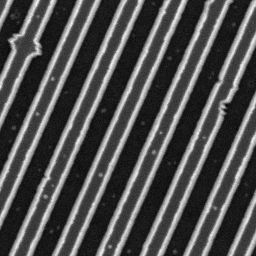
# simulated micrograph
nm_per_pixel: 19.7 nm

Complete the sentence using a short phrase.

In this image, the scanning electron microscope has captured parallel lines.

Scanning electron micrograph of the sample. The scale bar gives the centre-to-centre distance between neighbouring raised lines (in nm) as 786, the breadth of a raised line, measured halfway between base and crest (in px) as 18.5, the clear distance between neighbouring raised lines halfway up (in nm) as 432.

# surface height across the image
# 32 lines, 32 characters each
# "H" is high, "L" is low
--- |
HLLLHHHLLLHHLLLHHHLLLHHLLLHHHLLL
HLLLHHLLLHHHLLLHHLLLHHHLLLHHLLLH
LLLHHHLLLHHLLLHHHLLLHHLLLHHHLLLH
LLLHHLLLHHHLLLHHLLLHHHLLLHHLLLHH
LLHHHLLLHHLLLHHHLLLHHLLLHHHLLLHH
LHHHHLLHHHLLLHHLLLHHHLLLHHLLLHHH
LLHHHLLHHHLLLHHLLLHHLLLHHHLLLHHL
LHHHLLLHHLLLHHHLLHHHLLLHHLLLHHHL
LHHLLLHHHLLLHHLLLHHHLLLHHLLLHHLL
HHHLLLHHLLLHHHLLLHHLLLHHHLLLHHLL
HHLLLHHHLLLHHLLLHHHLLLHHLLLHHHLL
HHLLLHHLLLHHHLLLHHLLLHHHLLLHHLLL
HLLLHHHLLLHHLLLHHHLLLHHLLLHHHLLL
HLLLHHLLLHHHLLLHHLLLHHHLLLHHLLLH
LLLLHHLLLHHLLLHHHLLLHHLLLHHHLLLH
LLLHHHLLLHHLLLHHLLLHHHLLLHHLLLHH
LLLHHLLLHHHLLLHHLLLHHLLLHHHLLLHH
LLHHHLLLHHLLLHHHLLLHHLLLHHHLLLHH
LLHHLLLHHHLLLHHLLLHHHLLLHHLLLHHH
LHHHLLLHHLLLHHHLLLHHLLLHHHLLLHHL
LHHLLLHHHLLLHHLLLHHHLLLHHLLLHHHL
HHHLLLHHLLLHHHLLLHHLLLHHHLLLHHLL
HHLLLHHHLLLHHLLLHHHLLLHHLLLHHHLL
HHLLLHHLLLLHHLLLHHLLLHHHLLLHHLLL
HHLLLHHLLLHHHLLLHHLLLHHLLLHHHLLL
HLLLHHHLLLHHLLLHHHLLLHHLLLHHLLLH
HLLLHHLLLHHHLLLHHLLLHHHLLLHHLLLH
LLLHHHLLLHHLLLHHHLLLHHLLLHHHLLLH
LLLHHLLLHHHLLLHHLLLHHHLLLHHLLLHH
LLHHHLLLHHLLLHHHLLLHHLLLHHHLLLHH
LLHHLLLHHHLLLHHLLLHHHLLLHHLLLHHH
LHHHLLLHHLLLHHHLLLHHLLLHHHLLLHHL